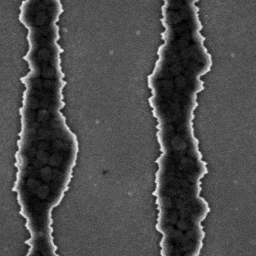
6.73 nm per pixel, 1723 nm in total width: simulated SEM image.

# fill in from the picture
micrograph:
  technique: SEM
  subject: one or a few lines or trenches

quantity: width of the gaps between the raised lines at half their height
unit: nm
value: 635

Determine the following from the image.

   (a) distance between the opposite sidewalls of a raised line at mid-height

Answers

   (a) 0.261 micrometres